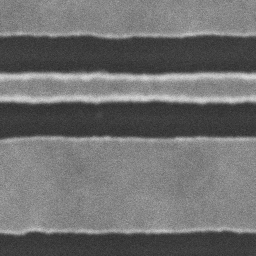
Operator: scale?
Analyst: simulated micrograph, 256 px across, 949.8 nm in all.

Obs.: lines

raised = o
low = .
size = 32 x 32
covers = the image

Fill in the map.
oooooooooooooooooooooooooooooooo
oooooooooooooooooooooooooooooooo
oooooooooooooooooooooooooooooooo
oooooooooooooooooooooooooooooooo
......o.....ooooooooooo.......o.
................................
................................
................................
................................
oooooooooooooooooooooooooooooooo
oooooooooooooooooooooooooooooooo
oooooooooooooooooooooooooooooooo
oooooooooooooooooooooooooooooooo
................................
................................
................................
................................
oooooooooooooooooooooooooooooooo
oooooooooooooooooooooooooooooooo
oooooooooooooooooooooooooooooooo
oooooooooooooooooooooooooooooooo
oooooooooooooooooooooooooooooooo
oooooooooooooooooooooooooooooooo
oooooooooooooooooooooooooooooooo
oooooooooooooooooooooooooooooooo
oooooooooooooooooooooooooooooooo
oooooooooooooooooooooooooooooooo
oooooooooooooooooooooooooooooooo
oooooooooooooooooooooooooooooooo
................................
................................
................................